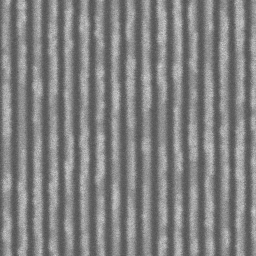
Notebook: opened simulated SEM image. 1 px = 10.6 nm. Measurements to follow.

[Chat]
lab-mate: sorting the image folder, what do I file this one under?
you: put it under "parallel lines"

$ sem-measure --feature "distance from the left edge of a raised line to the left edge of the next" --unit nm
165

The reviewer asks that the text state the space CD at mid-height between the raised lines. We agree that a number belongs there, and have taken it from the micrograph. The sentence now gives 0.103 microns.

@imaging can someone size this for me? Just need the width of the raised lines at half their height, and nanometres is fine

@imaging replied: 62.3